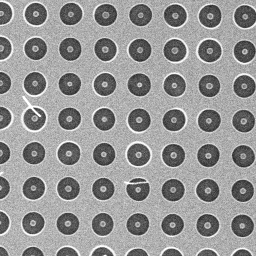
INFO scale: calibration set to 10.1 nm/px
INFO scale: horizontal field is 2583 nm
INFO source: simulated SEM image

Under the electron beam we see an array of small figures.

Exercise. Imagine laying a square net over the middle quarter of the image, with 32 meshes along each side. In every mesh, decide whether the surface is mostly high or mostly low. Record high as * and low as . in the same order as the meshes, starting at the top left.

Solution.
********************************
********************************
...******...******..*******.****
....****.....***.....****.....**
....***......***......***.....**
....***......***......***......*
....****.....***......***.....**
...*****....*****....*****....**
********************************
********************************
********************************
...*****....*****...*******..***
....***......***.....****.....**
....***......***......***......*
....***......***......***......*
....****....****.....****.....**
..*******..******...******...***
********************************
********************************
..******************************
....****....****.....****....***
....***......***......***.....**
....***......**.......**......**
....***......***......**......**
...*****....****.....****.....**
**********.*******..******...***
********************************
********************************
..*******..*******..************
....****....****.....****....***
....***......***.....****.....**
....***......**.......**......**